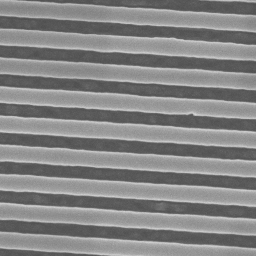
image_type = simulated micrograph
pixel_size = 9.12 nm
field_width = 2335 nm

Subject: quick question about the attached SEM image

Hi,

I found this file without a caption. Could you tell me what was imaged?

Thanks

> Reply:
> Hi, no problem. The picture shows parallel lines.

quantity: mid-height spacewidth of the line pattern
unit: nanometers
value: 117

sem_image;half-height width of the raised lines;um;0.149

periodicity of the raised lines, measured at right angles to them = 0.265 micrometres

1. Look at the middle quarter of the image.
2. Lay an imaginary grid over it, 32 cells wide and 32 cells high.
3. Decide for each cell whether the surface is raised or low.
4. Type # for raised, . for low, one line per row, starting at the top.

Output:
###############.................
################################
################################
.###############################
.................###############
................................
................................
##############..................
##########################......
################################
################################
............####################
............................##..
................................
#########.......................
########################........
################################
################################
.......#...#####################
.......................#..######
................................
####............................
##################..............
################################
################################
......##########################
...................#.###########
................................
................................
##############..................
###############################.
################################